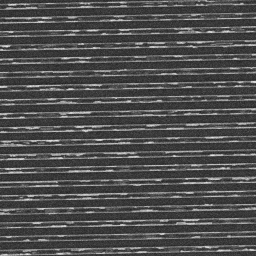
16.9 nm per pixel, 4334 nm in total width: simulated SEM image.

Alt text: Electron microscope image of parallel lines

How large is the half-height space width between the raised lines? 135 nm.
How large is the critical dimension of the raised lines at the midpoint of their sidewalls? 91 nm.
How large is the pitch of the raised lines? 0.231 µm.